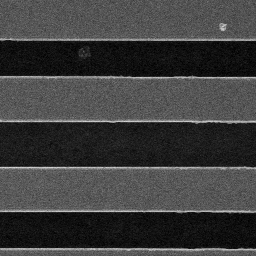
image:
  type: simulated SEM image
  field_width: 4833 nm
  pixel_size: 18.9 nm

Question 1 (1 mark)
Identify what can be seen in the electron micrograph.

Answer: lines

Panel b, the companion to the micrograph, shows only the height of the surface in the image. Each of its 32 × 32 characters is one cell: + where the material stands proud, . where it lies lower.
++++++++++++++++++++++++++++++++
++++++++++++++++++++++++++++++++
++++++++++++++++++++++++++++++++
++++++++++++++++++++++++++++++++
++++++++++++++++++++++++++++++++
................................
................................
................................
................................
................................
++++++++++++++++++++++++++++++++
++++++++++++++++++++++++++++++++
++++++++++++++++++++++++++++++++
++++++++++++++++++++++++++++++++
++++++++++++++++++++++++++++++++
................................
................................
................................
................................
................................
................................
++++++++++++++++++++++++++++++++
++++++++++++++++++++++++++++++++
++++++++++++++++++++++++++++++++
++++++++++++++++++++++++++++++++
++++++++++++++++++++++++++++++++
..............................++
................................
................................
................................
................................
++++++++++++++++++++++++++++++++